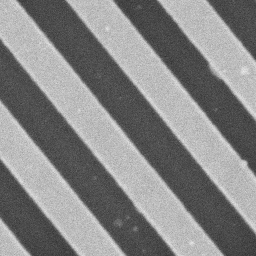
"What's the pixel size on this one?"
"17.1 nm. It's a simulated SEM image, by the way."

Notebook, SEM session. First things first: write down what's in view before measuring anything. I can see lines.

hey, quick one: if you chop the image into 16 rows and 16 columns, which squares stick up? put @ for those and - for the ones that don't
@----@@---@@@---
@@---@@@---@@@--
@@@---@@@---@@@-
-@@@---@@@---@@@
--@@@---@@@---@@
---@@----@@---@@
---@@@---@@@---@
@---@@@---@@@---
@@---@@@---@@@--
@@@---@@@---@@@-
@@@----@@@---@@@
-@@@---@@@---@@@
--@@@---@@@---@@
---@@@---@@@---@
@---@@@---@@@---
@@---@@----@@@--